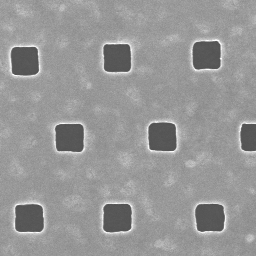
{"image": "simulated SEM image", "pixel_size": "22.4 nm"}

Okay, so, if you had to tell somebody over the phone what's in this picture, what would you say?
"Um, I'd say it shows a regular array of holes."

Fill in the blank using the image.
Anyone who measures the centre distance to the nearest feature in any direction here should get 2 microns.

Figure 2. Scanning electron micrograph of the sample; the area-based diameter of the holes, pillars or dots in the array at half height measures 696 nanometres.